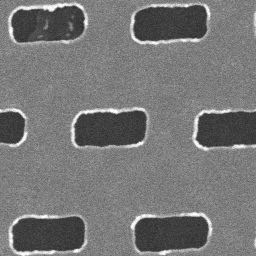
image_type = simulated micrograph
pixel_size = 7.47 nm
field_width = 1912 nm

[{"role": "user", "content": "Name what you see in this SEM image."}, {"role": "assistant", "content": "holes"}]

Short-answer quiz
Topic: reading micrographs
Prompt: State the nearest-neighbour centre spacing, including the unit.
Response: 905 nanometers